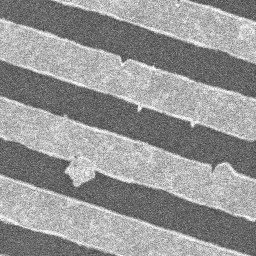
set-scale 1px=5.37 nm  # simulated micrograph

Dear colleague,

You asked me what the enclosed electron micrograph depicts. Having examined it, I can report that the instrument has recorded one or a few lines or trenches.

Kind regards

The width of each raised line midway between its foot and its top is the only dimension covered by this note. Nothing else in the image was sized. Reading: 0.204 µm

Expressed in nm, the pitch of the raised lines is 403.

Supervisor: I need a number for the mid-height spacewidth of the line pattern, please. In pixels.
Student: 37.1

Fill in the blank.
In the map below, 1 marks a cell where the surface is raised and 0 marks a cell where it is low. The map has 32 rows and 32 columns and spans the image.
00000000111111111111111110000000
00000000000001111111111111110000
00000000000000001111111111111100
11110000000000000011111111111111
11111100000000000000001111111111
11111111110000000000000001111111
11111111111110000000000000000111
11111111111111100000000000000001
00011111111111111110000000000000
00000001111111111111110000000000
00000000001111111111111110000000
00000000000001111111111111110000
10000000000000001111111111111111
11110000000000000001111111111111
11111110000000000000001111111111
11111111110000000000000001111111
11111111111110000000000000001111
01111111111111110000000000000001
00001111111111111110000000000000
00000000111111111111110000000000
00000000011111111111111110000000
00000000111101111111111111111000
10000000011000001111111111111110
11110000000000000000111111111111
11111110000000000000000111111111
11111111110000000000000001111111
11111111111111000000000000001111
01111111111111111000000000000000
00011111111111111111000000000000
00000000111111111111111000000000
00000000001111111111111111000000
00000000000000111111111111111000